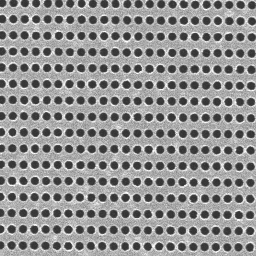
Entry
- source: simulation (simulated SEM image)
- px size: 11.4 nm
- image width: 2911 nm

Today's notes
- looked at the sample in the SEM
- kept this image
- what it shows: a regular array of holes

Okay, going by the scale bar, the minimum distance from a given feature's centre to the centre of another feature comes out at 128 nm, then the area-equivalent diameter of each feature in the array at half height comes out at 89.8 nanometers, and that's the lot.